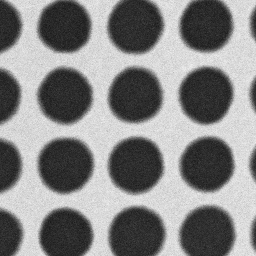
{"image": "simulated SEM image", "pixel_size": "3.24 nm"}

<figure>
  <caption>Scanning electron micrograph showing holes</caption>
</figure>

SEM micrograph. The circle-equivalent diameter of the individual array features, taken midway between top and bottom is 55.2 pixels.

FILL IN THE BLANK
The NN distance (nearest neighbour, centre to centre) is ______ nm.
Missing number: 225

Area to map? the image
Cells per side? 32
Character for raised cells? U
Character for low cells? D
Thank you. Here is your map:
DUUUUUDDDDUUUUUDDDDUUUUUDDDDUUUU
DDUUUDDDDDDUUUDDDDDDUUUDDDDDDUUU
DDDUUDDDDDDUUUDDDDDDUUUDDDDDDUUD
DDDUUDDDDDDUUDDDDDDDUUDDDDDDDUUD
DDUUUDDDDDDUUUDDDDDDUUUDDDDDDUUU
DDUUUUDDDDDUUUDDDDDUUUUDDDDDUUUU
UUUUUUUDDUUUUUUUDDUUUUUUUDUUUUUU
UUUUUUUUUUUUUUUUUUUUUUUUUUUUUUUU
UUUUUUUDDUUUUUUUDUUUUUUUUDDUUUUU
DUUUUUDDDDUUUUUDDDDUUUUDDDDDUUUU
DDUUUDDDDDDUUUDDDDDDUUUDDDDDDUUU
DDDUUDDDDDDDUUDDDDDDUUDDDDDDDUUD
DDDUUDDDDDDUUUDDDDDDUUDDDDDDDUUD
DDUUUDDDDDDUUUDDDDDDUUUDDDDDDUUU
DDUUUUDDDDUUUUUDDDDUUUUDDDDDUUUU
UUUUUUUUDUUUUUUUUUUUUUUUUDUUUUUU
UUUUUUUUUUUUUUUUUUUUUUUUUUUUUUUU
UUUUUUUDDDUUUUUUDDDUUUUUUDDDUUUU
DDUUUDDDDDDUUUDDDDDDUUUDDDDDDUUU
DDDUUDDDDDDDUUDDDDDDUUUDDDDDDUUD
DDDUUDDDDDDDUUDDDDDDUUUDDDDDDUUD
DDDUUDDDDDDDUUDDDDDDUUUDDDDDDUUD
DDUUUDDDDDDUUUDDDDDDUUUDDDDDDUUU
DUUUUUDDDDUUUUUDDDDUUUUUDDDDUUUU
UUUUUUUUUUUUUUUUUUUUUUUUUUUUUUUU
UUUUUUUUUUUUUUUUUUUUUUUUUUUUUUUU
DUUUUUDDDDUUUUUDDDDUUUUUDDDDUUUU
DDUUUDDDDDDUUUDDDDDDUUUDDDDDDUUU
DDDUUDDDDDDUUUDDDDDDDUUDDDDDDUUD
DDDUUDDDDDDDUUDDDDDDDUDDDDDDDUUD
DDDUUDDDDDDUUUDDDDDDUUUDDDDDDUUD
DDUUUUDDDDDUUUDDDDDDUUUDDDDDDUUU